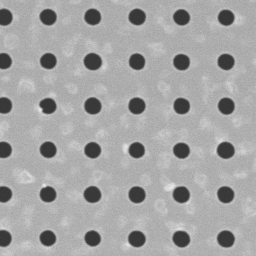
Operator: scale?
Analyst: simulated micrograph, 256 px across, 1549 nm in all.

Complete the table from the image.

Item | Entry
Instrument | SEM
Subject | a regular array of holes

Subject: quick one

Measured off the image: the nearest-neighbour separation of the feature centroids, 266 nanometres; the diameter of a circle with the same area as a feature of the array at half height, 101 nanometers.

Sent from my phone